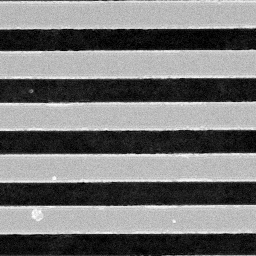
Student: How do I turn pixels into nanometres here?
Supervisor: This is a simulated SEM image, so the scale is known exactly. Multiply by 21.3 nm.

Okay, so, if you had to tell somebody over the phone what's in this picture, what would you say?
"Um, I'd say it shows lines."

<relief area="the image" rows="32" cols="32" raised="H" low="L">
HHHHHHHHHHHHHHHHHHHHHHHHHHHHHHHH
HHHHHHHHHHHHHHHHHHHHHHHHHHHHHHHH
HHHHHHHHHHHHHHHHHHHHHHHHHHHHHHHH
HHHHHHHHHHHHHHHHHHHHHHHHHHHHHHLL
LLLLLLLLLLLLLLLLLLLLLLLLLLLLLLLL
LLLLLLLLLLLLLLLLLLLLLLLLLLLLLLLL
HHHHHHHHHHHHHHHHHHHHHHHHHHHHHHHH
HHHHHHHHHHHHHHHHHHHHHHHHHHHHHHHH
HHHHHHHHHHHHHHHHHHHHHHHHHHHHHHHH
HHHHHHHHHHHHHHHHHHHHHHHHHHHHHHHH
LLLLLLLLLLLLLLLLLLLLLLLLLLLLLLLL
LLLLLLLLLLLLLLLLLLLLLLLLLLLLLLLL
LLLLLLLLLLLLLLLLLLLLLLLLLLLLLLLL
HHHHHHHHHHHHHHHHHHHHHHHHHHHHHHHH
HHHHHHHHHHHHHHHHHHHHHHHHHHHHHHHH
HHHHHHHHHHHHHHHHHHHHHHHHHHHHHHHH
LLLLLLLLLLLLLLLLLLLLLLLLLLLLLLLL
LLLLLLLLLLLLLLLLLLLLLLLLLLLLLLLL
LLLLLLLLLLLLLLLLLLLLLLLLLLLLLLLL
HHHHHHHHHHHHHHHHHHHHHHHHHHHHHHHH
HHHHHHHHHHHHHHHHHHHHHHHHHHHHHHHH
HHHHHHHHHHHHHHHHHHHHHHHHHHHHHHHH
HHHHHHHHHHHHHHHHHHHHHHHHHHHHHHHH
LLLLLLLLLLLLLLLLLLLLLLLLLLLLLLLL
LLLLLLLLLLLLLLLLLLLLLLLLLLLLLLLL
LLLLLLLLLLLLLLLLLLLLLLLLLLLLLLLL
HHHHHHHHHHHHHHHHHHHHHHHHHHHHHHHH
HHHHHHHHHHHHHHHHHHHHHHHHHHHHHHHH
HHHHHHHHHHHHHHHHHHHHHHHHHHHHHHHH
LLLLLLLLLLLLLLLLLLLLLLLLLLLLLLLL
LLLLLLLLLLLLLLLLLLLLLLLLLLLLLLLL
LLLLLLLLLLLLLLLLLLLLLLLLLLLLLLLL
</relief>